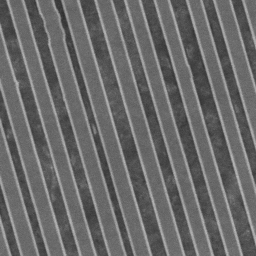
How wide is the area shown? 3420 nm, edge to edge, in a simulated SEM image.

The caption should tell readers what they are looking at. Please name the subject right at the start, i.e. parallel lines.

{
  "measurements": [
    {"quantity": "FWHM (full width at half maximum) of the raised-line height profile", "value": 0.202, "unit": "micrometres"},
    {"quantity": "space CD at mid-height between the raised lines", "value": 178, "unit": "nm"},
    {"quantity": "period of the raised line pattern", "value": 381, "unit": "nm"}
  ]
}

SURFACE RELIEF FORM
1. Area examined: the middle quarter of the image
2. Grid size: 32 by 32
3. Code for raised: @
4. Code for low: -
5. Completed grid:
@@--@@@@----@@@@@---@@@@---@@@@-
@@--@@@@@----@@@@---@@@@----@@@-
@@@--@@@@----@@@@---@@@@----@@@@
@@@--@@@@----@@@@----@@@----@@@@
@@@--@@@@-----@@@@---@@@@---@@@@
@@@---@@@@----@@@@---@@@@----@@@
@@@@--@@@@----@@@@----@@@----@@@
@@@@--@@@@----@@@@@---@@@@---@@@
@@@@--@@@@@----@@@@---@@@@----@@
@@@@@--@@@@----@@@@---@@@@----@@
-@@@@--@@@@----@@@@----@@@----@@
-@@@@--@@@@-----@@@@---@@@@---@@
-@@@@---@@@@----@@@@---@@@@----@
--@@@@--@@@@----@@@@----@@@----@
--@@@@--@@@@----@@@@@---@@@@---@
--@@@@--@@@@@----@@@@---@@@@----
--@@@@@--@@@@----@@@@---@@@@----
---@@@@--@@@@----@@@@----@@@----
---@@@@--@@@@-----@@@@---@@@@---
---@@@@---@@@@----@@@@---@@@@---
----@@@@--@@@@----@@@@----@@@---
@---@@@@--@@@@----@@@@@---@@@@--
@---@@@@--@@@@@----@@@@---@@@@--
@---@@@@@--@@@@----@@@@---@@@@--
@----@@@@--@@@@----@@@@----@@@@-
@@---@@@@--@@@@-----@@@@---@@@@-
@@---@@@@---@@@@----@@@@---@@@@-
@@----@@@---@@@@----@@@@----@@@-
@@----@@@@--@@@@----@@@@@---@@@@
@@@---@@@@--@@@@@----@@@@---@@@@
@@@---@@@@@--@@@@----@@@@---@@@@
@@@----@@@@--@@@@----@@@@----@@@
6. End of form